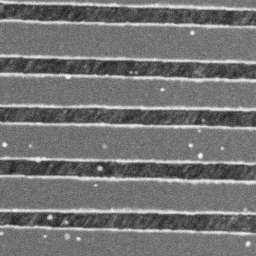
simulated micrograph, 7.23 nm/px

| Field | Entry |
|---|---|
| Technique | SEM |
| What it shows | lines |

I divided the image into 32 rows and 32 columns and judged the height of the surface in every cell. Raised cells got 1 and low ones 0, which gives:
00001111111111111111111111111111
00000000000000000000000000000000
00000000000000000000000000000000
11111111111111111111111111111111
11111111111111111111111111111111
11111111111111111111111111111111
11111111111111111111111111111111
00000000000000000111111111111111
00000000000000000000000000000000
11111111111000000000000000000000
11111111111111111111111111111111
11111111111111111111111111111111
11111111111111111111111111111111
00000000000000011111111111111111
00000000000000000000000000000000
11111100000000000000000000000000
11111111111111111111111111111111
11111111111111111111111111111111
11111111111111111111111111111111
11111111111111111111111111111111
00000000000000000000000000000001
00000000000000000000000000000000
11111111111111111111111000000000
11111111111111111111111111111111
11111111111111111111111111111111
11111111111111111111111111111111
00000000000000000111111111111111
00000000000000000000000000000000
11111110000000000000000000000000
11111111111111111111111111111111
11111111111111111111111111111111
11111111111111111111111111111111